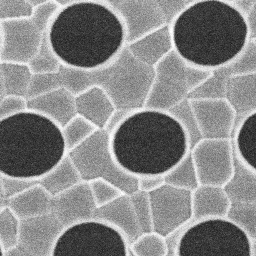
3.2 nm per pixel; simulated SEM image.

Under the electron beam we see holes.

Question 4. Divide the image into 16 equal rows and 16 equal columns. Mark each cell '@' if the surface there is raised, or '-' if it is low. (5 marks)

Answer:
@@@@---@@@@@---@
@@@-----@@@----@
@@@-----@@@----@
@@@@---@@@@----@
@@@@@@@@@@@@@@@@
@@@@@@@@@@@@@@@@
@@@@@@@@@@@@@@@@
---@@@@@---@@@@-
----@@@-----@@@-
----@@@-----@@@-
---@@@@@---@@@@@
@@@@@@@@@@@@@@@@
@@@@@@@@@@@@@@@@
@@@@@@@@@@@@@@@@
@@@@---@@@@@---@
@@@-----@@@-----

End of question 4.